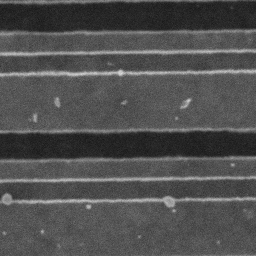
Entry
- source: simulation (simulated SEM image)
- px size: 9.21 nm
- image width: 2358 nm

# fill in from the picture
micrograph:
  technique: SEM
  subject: lines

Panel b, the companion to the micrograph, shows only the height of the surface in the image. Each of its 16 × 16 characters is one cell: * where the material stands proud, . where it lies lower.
................
................
****************
****************
****************
****************
****************
****************
................
................
****************
****************
****************
****************
****************
****************